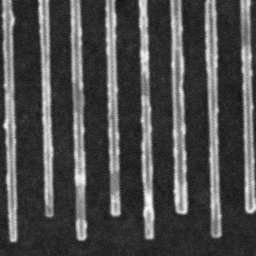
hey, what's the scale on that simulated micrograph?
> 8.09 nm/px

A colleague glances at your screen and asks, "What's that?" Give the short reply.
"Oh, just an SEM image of parallel lines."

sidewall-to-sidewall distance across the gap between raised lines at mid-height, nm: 201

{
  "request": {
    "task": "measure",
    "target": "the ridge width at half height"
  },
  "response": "64.7 nanometers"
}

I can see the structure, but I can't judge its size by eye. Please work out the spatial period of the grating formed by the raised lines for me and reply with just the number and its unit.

0.275 micrometres